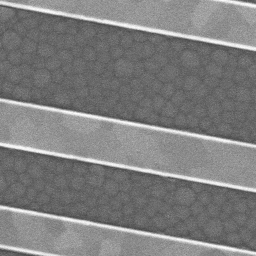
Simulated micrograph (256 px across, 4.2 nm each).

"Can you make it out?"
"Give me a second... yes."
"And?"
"one or a few lines or trenches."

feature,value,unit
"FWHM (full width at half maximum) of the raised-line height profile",185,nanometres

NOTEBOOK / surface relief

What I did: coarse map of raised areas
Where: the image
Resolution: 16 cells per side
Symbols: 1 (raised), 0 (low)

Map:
0011111111111111
0000000111111111
0000000000000111
0000000000000000
0000000000000000
0000000000000000
1000000000000000
1111111000000000
1111111111110000
0001111111111111
0000000011111111
0000000000000011
0000000000000000
1110000000000000
1111111110000000
0111111111111100